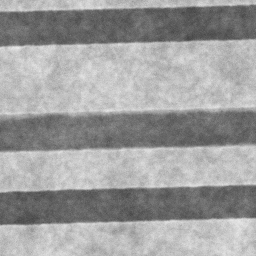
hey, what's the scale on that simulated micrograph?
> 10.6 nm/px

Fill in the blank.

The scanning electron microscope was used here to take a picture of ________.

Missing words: lines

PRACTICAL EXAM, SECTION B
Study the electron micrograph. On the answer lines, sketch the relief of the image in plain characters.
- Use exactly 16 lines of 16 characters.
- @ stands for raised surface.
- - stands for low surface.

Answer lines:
@@@@@@@---------
----------------
---------------@
@@@@@@@@@@@@@@@@
@@@@@@@@@@@@@@@@
@@@@@@@@@@@@@@@@
@@@@@@@@@@@@@@@@
----------------
----------------
---@@@@@@@@@@@@@
@@@@@@@@@@@@@@@@
@@@@@@@@@@@@@@@@
----------------
----------------
@@@@@@@@@@@@@@@@
@@@@@@@@@@@@@@@@